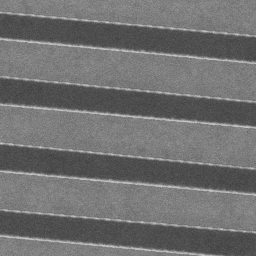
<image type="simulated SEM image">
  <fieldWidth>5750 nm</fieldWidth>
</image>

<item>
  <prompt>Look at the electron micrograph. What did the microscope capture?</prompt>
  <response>lines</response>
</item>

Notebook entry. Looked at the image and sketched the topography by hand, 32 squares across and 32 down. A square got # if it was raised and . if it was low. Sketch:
................................
................................
##########......................
#####################...........
################################
......##########################
................################
...........................#####
................................
................................
#########.......................
###################.............
#############################...
....############################
...............#################
..........................######
................................
................................
######..........................
################................
##########################......
################################
...........#####################
......................##########
................................
................................
###.............................
##############..................
##########################......
################################
..........######################
.....................###########